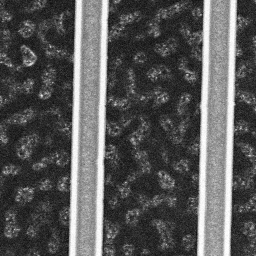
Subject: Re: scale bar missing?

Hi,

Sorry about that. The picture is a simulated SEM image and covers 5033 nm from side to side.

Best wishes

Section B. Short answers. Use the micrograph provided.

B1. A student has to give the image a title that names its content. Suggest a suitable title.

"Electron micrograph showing one or a few lines or trenches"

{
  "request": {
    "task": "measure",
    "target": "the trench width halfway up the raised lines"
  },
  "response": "2020 nm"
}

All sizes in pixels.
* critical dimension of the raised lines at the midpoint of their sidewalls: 25.6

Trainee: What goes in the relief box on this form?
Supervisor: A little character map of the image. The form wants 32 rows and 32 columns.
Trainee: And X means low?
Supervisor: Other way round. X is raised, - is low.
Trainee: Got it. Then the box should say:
----------XXX-------------XXX---
----------XXX-------------XXX---
----------XXX-------------XXX---
----------XXX-------------XXX---
----------XXX-------------XXX---
----------XXX-------------XXX---
----------XXX-------------XXX---
----------XXX-------------XXX---
----------XXX-------------XXX---
----------XXX-------------XXX---
----------XXX-------------XXX---
----------XXX-------------XXX---
----------XXX-------------XXX---
----------XXX-------------XXX---
----------XXX-------------XXX---
----------XXX-------------XXX---
---------XXXX-------------XXX---
---------XXXX-------------XXX---
---------XXXX-------------XXX---
---------XXXX------------XXXX---
---------XXX-------------XXXX---
---------XXX-------------XXXX---
---------XXX-------------XXXX---
---------XXX-------------XXX----
---------XXX-------------XXX----
---------XXX-------------XXX----
---------XXX-------------XXX----
---------XXX-------------XXX----
---------XXX-------------XXX----
---------XXX-------------XXX----
---------XXX-------------XXX----
---------XXX-------------XXX----